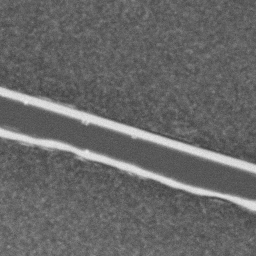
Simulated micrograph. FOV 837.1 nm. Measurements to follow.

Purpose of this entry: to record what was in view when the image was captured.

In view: one or a few lines or trenches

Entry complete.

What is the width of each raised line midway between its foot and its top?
123 nm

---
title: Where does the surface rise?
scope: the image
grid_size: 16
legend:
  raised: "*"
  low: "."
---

................
................
................
................
................
................
***.............
******..........
.********.......
.....********...
........********
...........*****
...............*
................
................
................